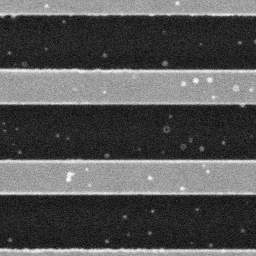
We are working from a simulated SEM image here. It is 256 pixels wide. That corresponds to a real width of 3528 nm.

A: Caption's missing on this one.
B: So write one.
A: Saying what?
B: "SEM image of lines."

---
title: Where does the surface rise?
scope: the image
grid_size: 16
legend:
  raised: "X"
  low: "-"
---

XXXXXXXXXXXXXXXX
----------------
----------------
----------------
XXXXXXXXXXXXXXXX
XXXXXXXXXXXXXXXX
----------------
----------------
----------------
----------------
XXXXXXXXXXXXXXXX
XXXXXXXXXXXXXXXX
----------------
----------------
----------------
----------------